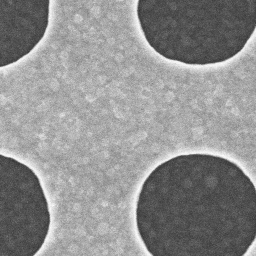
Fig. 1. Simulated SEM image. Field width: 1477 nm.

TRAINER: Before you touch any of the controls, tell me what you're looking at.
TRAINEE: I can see holes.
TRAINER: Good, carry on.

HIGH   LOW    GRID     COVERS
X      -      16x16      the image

---XXXXXX-------
---XXXXXX-------
---XXXXXX-------
--XXXXXXXX-----X
XXXXXXXXXXXXXXXX
XXXXXXXXXXXXXXXX
XXXXXXXXXXXXXXXX
XXXXXXXXXXXXXXXX
XXXXXXXXXXXXXXXX
XXXXXXXXXXXXXXXX
--XXXXXXXX-----X
---XXXXXX-------
---XXXXXX-------
---XXXXX--------
---XXXXXX-------
---XXXXXX-------